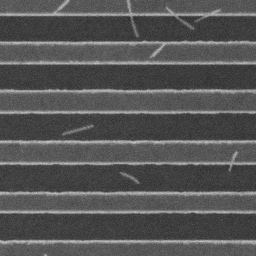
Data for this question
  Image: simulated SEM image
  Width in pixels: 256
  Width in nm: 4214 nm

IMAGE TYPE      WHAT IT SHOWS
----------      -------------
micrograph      lines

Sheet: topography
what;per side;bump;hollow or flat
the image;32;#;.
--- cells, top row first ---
################################
################################
................................
................................
................................
################################
################################
################################
................................
................................
................................
################################
################################
################################
................................
................................
................................
................................
################################
################################
..#####.###.##........#.....####
................................
................................
................................
################################
################################
#.###.######.######..#..########
................................
................................
................................
################################
################################